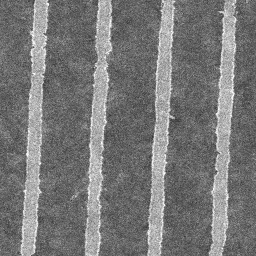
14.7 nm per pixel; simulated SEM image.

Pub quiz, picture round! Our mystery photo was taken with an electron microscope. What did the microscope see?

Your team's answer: parallel lines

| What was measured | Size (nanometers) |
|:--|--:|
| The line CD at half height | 180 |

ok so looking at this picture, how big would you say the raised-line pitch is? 925 nm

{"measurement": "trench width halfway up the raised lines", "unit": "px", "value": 50.6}